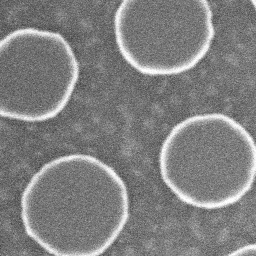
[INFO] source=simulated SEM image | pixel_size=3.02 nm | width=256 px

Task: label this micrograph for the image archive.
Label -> raised bodies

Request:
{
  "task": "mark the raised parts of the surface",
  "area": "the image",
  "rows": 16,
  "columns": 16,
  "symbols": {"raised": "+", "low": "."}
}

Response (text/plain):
........+++++...
.......++++++...
++++...++++++...
+++++...+++++...
+++++...........
++++............
++++............
............++..
...........++++.
..........++++++
...++++...++++++
..++++++...+++++
.+++++++....+++.
.+++++++........
..+++++.........
...++++........+